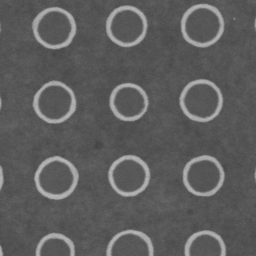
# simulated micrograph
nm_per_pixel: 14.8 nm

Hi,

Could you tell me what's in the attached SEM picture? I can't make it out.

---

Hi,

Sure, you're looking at a regular array of raised bodies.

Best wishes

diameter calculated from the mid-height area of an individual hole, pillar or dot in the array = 568 nm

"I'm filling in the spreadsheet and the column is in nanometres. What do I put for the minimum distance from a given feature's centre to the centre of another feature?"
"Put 1080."